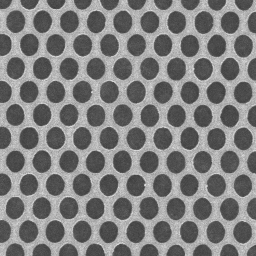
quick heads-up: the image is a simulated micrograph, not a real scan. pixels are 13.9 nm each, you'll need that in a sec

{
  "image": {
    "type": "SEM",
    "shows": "a regular array of holes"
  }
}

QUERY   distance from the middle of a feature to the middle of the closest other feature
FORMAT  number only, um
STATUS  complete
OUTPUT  0.369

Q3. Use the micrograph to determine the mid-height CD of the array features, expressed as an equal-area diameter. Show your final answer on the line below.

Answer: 287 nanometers